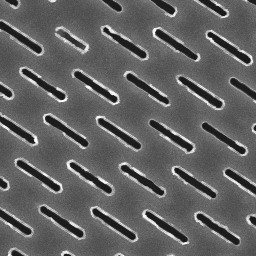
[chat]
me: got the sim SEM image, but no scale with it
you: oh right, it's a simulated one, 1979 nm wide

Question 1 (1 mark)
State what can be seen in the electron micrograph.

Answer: a regular array of holes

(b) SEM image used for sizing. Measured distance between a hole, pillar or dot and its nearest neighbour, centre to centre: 401 nanometres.